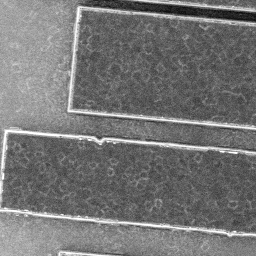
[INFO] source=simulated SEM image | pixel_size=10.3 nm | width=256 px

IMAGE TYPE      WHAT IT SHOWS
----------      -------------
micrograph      one or a few lines or trenches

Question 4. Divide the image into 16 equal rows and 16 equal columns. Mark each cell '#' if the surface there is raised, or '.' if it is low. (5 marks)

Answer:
..............##
.....###########
.....###########
.....###########
.....###########
....############
....############
...........#####
####............
###############.
################
################
################
...#############
..............##
................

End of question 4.